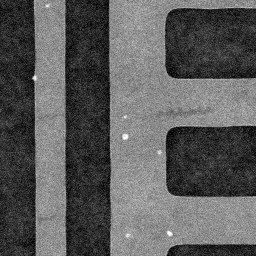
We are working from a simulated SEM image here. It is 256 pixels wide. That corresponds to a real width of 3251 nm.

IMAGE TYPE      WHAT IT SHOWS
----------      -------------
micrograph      groups of lines, slits or small figures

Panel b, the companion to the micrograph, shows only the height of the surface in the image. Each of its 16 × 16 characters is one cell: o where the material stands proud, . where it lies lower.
..oo...oooo..o..
..oo...ooo......
..oo...ooo......
..oo...ooo......
..oo...ooo......
..oo...ooooooooo
..oo...ooooooooo
..oo...ooooooooo
..oo...ooo......
..oo...ooo......
..oo...ooo......
..oo...ooo......
..oo...ooooooooo
..oo...ooooooooo
..oo...ooooooooo
..oo...oooo.....